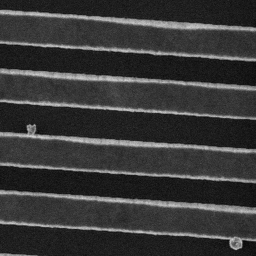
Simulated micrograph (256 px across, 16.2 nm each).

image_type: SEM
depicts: lines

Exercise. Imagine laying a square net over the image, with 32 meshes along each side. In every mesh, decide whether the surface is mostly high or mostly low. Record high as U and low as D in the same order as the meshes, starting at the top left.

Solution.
DDDDDDDDDDDDDDDDDDDDDDDDDDDDDDDD
UDDDDDDDDDDDDDDDDDDDDDDDDDDDDDDD
UUUUUUUUUUUUUUUDDDDDDDDDDDDDDDDD
UUUUUUUUUUUUUUUUUUUUUUUUUUUUUUDD
UUUUUUUUUUUUUUUUUUUUUUUUUUUUUUUU
UUUUUUUUUUUUUUUUUUUUUUUUUUUUUUUU
DDDDDDDDDDDDDDDDDUUUUUUUUUUUUUUU
DDDDDDDDDDDDDDDDDDDDDDDDDDDDDDUU
DDDDDDDDDDDDDDDDDDDDDDDDDDDDDDDD
UUUUUUUUUDDDDDDDDDDDDDDDDDDDDDDD
UUUUUUUUUUUUUUUUUUUUUUUUUUDDDDDD
UUUUUUUUUUUUUUUUUUUUUUUUUUUUUUUU
UUUUUUUUUUUUUUUUUUUUUUUUUUUUUUUU
DDDDDDDDDDDDUUUUUUUUUUUUUUUUUUUU
DDDDDDDDDDDDDDDDDDDDDDDDDDUUUUUU
DDDDDDDDDDDDDDDDDDDDDDDDDDDDDDDD
DDDUDDDDDDDDDDDDDDDDDDDDDDDDDDDD
UUUUUUUUUUUDDDDDDDDDDDDDDDDDDDDD
UUUUUUUUUUUUUUUUUUUUUUUUUUUDDDDD
UUUUUUUUUUUUUUUUUUUUUUUUUUUUUUUU
UUUUUUUUUUUUUUUUUUUUUUUUUUUUUUUU
DDDDDDDDDDDDUUUUUUUUUUUUUUUUUUUU
DDDDDDDDDDDDDDDDDDDDDDDDDDDUUUUU
DDDDDDDDDDDDDDDDDDDDDDDDDDDDDDDD
UUUUUUUUUDDDDDDDDDDDDDDDDDDDDDDD
UUUUUUUUUUUUUUUUUUUUUUDDDDDDDDDD
UUUUUUUUUUUUUUUUUUUUUUUUUUUUUUUU
UUUUUUUUUUUUUUUUUUUUUUUUUUUUUUUU
DDDDDDDDUUUUUUUUUUUUUUUUUUUUUUUU
DDDDDDDDDDDDDDDDDDDDDDDUUUUUUUUU
DDDDDDDDDDDDDDDDDDDDDDDDDDDDDUDD
DDDDDDDDDDDDDDDDDDDDDDDDDDDDDDDD